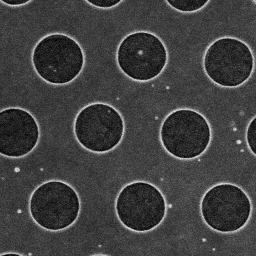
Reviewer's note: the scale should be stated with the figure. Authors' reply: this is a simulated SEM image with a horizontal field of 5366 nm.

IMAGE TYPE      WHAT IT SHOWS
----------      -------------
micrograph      a regular array of holes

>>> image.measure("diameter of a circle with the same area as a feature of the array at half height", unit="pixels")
48.5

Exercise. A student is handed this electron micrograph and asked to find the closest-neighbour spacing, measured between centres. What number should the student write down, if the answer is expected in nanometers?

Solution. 1760